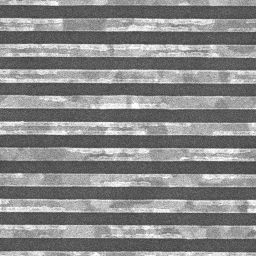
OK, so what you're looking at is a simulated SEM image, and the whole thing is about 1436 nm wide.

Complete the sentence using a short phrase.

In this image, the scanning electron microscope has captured parallel lines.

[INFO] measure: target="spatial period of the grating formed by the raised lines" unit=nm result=145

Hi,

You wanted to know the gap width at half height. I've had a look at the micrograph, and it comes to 76.4 nanometres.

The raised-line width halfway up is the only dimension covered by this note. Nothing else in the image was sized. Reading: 71.5 nm